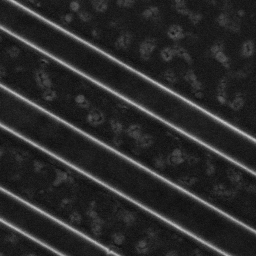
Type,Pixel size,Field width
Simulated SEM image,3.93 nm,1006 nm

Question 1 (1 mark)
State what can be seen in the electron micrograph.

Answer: one or a few lines or trenches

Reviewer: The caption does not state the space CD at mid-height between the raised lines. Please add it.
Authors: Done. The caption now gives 0.195 µm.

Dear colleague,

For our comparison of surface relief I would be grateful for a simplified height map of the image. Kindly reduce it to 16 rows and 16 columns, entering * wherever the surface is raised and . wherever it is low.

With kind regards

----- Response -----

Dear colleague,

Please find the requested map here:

**..............
***.............
.****...........
...****.........
.....****.......
.......***......
**......****....
****......****..
.*****......****
...****......***
.....****......*
......*****.....
*.......*****...
***.......****..
.****.......****
...****......***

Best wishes